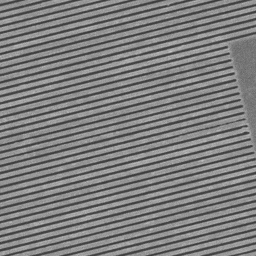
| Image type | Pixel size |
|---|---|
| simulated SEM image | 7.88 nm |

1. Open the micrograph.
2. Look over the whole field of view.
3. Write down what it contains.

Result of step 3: parallel lines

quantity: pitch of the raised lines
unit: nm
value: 53.6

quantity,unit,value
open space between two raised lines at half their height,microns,0.021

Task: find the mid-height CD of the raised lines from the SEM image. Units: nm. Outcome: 35.4